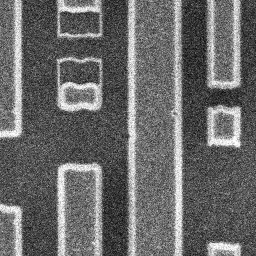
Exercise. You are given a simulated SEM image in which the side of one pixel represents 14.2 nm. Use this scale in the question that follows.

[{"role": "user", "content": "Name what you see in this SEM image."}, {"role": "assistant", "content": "one or a few lines or trenches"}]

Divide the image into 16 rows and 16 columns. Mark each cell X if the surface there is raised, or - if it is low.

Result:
X---XX--XXX--XX-
X-------XXX--XX-
X-------XXX--XX-
X-------XXX--XX-
X-------XXX--XX-
X---XX--XXX-----
X---XX--XXX-----
X-------XXX--XX-
--------XXX--XX-
--------XXX-----
----XX--XXX-----
----XX--XXX-----
----XX--XXX-----
X---XX--XXX-----
X---XX--XXX-----
X---XX--XXX-----